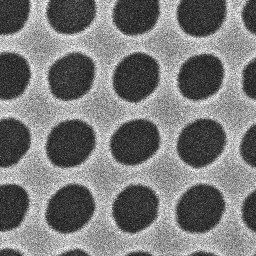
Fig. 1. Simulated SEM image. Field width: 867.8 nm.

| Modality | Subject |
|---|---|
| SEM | a regular array of holes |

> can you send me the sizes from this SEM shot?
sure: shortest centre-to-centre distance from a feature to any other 218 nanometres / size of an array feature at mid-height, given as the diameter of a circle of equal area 167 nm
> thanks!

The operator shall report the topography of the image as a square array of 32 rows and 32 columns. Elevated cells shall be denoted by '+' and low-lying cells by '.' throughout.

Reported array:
....++......++......++......+++.
....++......++......++......++..
...+++......++......++......++..
...++++....++++....++++.....+++.
++++++++++++++++.+++++++..++++++
++++++++++++++++++++++++++++++++
..++++++++++++++++++++++++++++++
...++++.....+++.....+++.....+++.
....++......++......+++.....++..
....++......++......++......++..
....++......++......++......++..
...+++.....+++.....+++.....++++.
..+++++..++++++...++++++.+++++++
++++++++++++++++++++++++++++++++
++++++++++++++++++++++++++++++++
...++++....++++....+++++....++++
....++......++......+++.....+++.
....++......++......++......++..
....++......++......++......++..
...+++.....+++.....+++.....+++..
..+++++...+++++..++++++...+++++.
++++++++++++++++++++++++++++++++
++++++++++++++++++++++++++++++++
...+++++...+++++...+++++...+++++
....+++.....+++.....+++.....+++.
....++......++......++......++..
...+++......++......++......++..
...+++.....+++.....+++......++..
..++++....+++++...+++++....++++.
++++++++++++++++++++++++++++++++
++++++++++++++++++++++++++++++++
...+++++...++++++.++++++..++++++